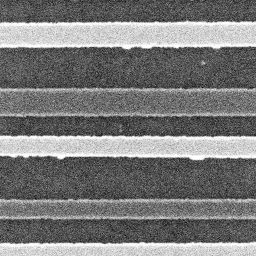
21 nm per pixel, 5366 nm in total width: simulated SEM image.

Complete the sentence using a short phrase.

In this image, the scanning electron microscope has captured lines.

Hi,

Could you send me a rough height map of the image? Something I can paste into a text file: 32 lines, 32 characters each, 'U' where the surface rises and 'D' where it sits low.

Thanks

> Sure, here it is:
DDDDDDDDDDDDDDDDDDDDDDDDDDDDDDDD
DDDDDDDDDDDDDDDDDDDDDDDDDDDDDDDD
DDDDDDDDDDDDDDDDDDDDDDDDDDDDDDDD
UUUUUUUUUUUUUUUUUUUUUUUUUUUUUUUU
UUUUUUUUUUUUUUUUUUUUUUUUUUUUUUUU
UUUUUUUUUUUUUUUUUUUUUUUUUUUUUUUU
DDDDDDDDDDDDDDDDDDDDDDDDDDDDDDDD
DDDDDDDDDDDDDDDDDDDDDDDDDDDDDDDD
DDDDDDDDDDDDDDDDDDDDDDDDDDDDDDDD
DDDDDDDDDDDDDDDDDDDDDDDDDDDDDDDD
DDDDDDDDDDDDDDDDDDDDDDDDDDDDDDDD
UUUUUUUUUUUUUUUUUUUUUUUUUUUUUUUU
UUUUUUUUUUUUUUUUUUUUUUUUUUUUUUUU
UUUUUUUUUUUUUUUUUUUUUUUUUUUUUUUU
DDUUDUDDDDDDDUDDDDDUDDDDDDDDDDDD
DDDDDDDDDDDDDDDDDDDDDDDDDDDDDDDD
DDDDDDDDDDDDDDDDDDDDDDDDDDDDDDDD
UUUUUUUUUUUUUUUUUUUUUUUUUUUUUUUU
UUUUUUUUUUUUUUUUUUUUUUUUUUUUUUUU
DDDDDDDDDDDDDDUDUUUUUUUUUUUUUUUU
DDDDDDDDDDDDDDDDDDDDDDDDDDDDDDDD
DDDDDDDDDDDDDDDDDDDDDDDDDDDDDDDD
DDDDDDDDDDDDDDDDDDDDDDDDDDDDDDDD
DDDDDDDDDDDDDDDDDDDDDDDDDDDDDDDD
DDDDDDDDDDDDDDDDDDDDDDDDDDDDDDDD
UUUUUUUUUUUUUUUUUUUUUUUUUUUUUUUU
UUUUUUUUUUUUUUUUUUUUUUUUUUUUUUUU
DDDDDDDDDDDDDDDDDDDDDDDDDDDDDDDD
DDDDDDDDDDDDDDDDDDDDDDDDDDDDDDDD
DDDDDDDDDDDDDDDDDDDDDDDDDDDDDDDD
UDDDUUUUUUUUUUDUUUUUUUUUUUUUUUUU
UUUUUUUUUUUUUUUUUUUUUUUUUUUUUUUU